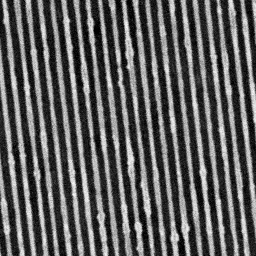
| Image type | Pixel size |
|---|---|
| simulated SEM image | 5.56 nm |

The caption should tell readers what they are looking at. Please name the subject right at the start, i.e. parallel lines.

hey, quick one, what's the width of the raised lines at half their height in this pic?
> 16.6 nm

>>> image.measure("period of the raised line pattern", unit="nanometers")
65.7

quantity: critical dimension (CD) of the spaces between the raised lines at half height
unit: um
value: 0.049